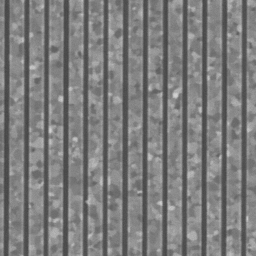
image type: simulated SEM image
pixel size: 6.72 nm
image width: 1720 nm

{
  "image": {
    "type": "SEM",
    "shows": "parallel lines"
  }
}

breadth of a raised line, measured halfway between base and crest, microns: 0.0924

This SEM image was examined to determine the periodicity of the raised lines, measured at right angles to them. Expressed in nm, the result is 133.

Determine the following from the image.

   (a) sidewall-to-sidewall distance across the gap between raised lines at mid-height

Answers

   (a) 43.7 nm